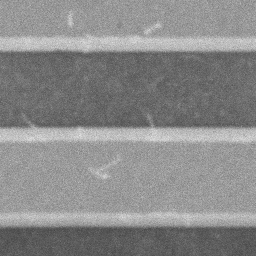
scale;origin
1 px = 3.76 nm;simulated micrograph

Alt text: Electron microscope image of one or a few lines or trenches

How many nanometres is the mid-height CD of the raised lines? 334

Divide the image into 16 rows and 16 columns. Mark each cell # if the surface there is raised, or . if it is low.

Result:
################
################
################
................
................
................
................
................
################
################
################
################
################
################
................
................